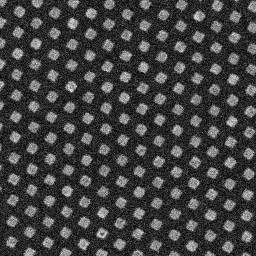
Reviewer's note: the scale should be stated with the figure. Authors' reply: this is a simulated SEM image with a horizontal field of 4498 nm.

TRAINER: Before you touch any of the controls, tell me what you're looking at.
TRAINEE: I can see a regular array of raised bodies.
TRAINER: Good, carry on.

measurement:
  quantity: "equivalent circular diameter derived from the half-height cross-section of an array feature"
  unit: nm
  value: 167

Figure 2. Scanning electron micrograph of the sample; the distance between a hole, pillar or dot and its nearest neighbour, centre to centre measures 0.362 um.